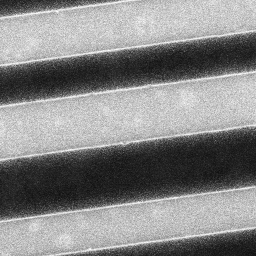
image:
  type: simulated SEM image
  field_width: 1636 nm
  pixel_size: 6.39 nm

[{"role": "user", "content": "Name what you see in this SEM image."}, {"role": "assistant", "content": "one or a few lines or trenches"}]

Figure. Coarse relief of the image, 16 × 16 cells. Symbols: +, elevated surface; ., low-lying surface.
+++++...........
................
...........+++++
....++++++++++++
++++++++++++++++
+++++++++.......
+...............
................
...........+++++
...+++++++++++++
++++++++++++++++
++++++++++++++++
++++++++++......
+++.............
..............++
.......+++++++++